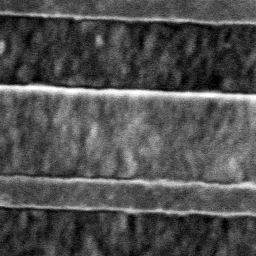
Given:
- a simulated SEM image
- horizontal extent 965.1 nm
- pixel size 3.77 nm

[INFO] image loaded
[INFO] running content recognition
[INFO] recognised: lines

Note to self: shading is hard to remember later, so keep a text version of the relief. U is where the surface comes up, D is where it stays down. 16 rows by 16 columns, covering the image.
UUUUUUUUUUUUUUUU
DDDDDDDDDDDDDDDD
DDDDDDDDDDDDDDDD
DDDDDDDDDDDDDDDD
DDDDDDDDDDDDDDDD
UUUUDDDDDDDDDDDD
UUUUUUUUUUUUUUUU
UUUUUUUUUUUUUUUU
UUUUUUUUUUUUUUUU
UUUUUUUUUUUUUUUU
UUUUUUUUUUUUUUUU
UUUUUUUUUUUUUUUU
UUUUUUUUUUUUUUUU
DDDDDDDDDDDDDDDD
DDDDDDDDDDDDDDDD
DDDDDDDDDDDDDDDD